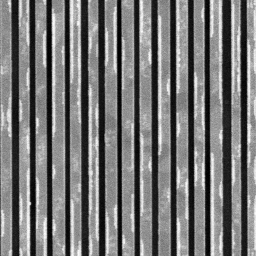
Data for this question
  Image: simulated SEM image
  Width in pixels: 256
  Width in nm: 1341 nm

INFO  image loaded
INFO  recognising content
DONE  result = parallel lines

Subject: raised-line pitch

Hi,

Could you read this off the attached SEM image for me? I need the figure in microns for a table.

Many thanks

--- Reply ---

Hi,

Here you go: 0.0926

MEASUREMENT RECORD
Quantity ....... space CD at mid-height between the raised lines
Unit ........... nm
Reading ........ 32.1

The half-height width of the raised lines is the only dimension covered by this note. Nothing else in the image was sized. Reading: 58.9 nanometres